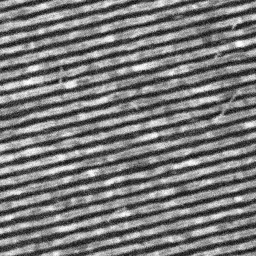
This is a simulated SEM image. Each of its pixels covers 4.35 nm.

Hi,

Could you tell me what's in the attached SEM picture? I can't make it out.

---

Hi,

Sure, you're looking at parallel lines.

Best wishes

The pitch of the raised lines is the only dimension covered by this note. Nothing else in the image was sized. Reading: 50.5 nanometres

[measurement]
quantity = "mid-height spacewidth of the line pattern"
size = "0.0301 µm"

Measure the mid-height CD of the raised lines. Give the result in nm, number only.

21.2